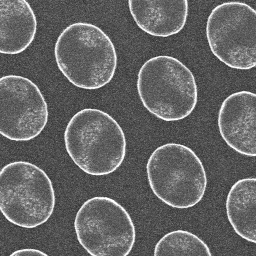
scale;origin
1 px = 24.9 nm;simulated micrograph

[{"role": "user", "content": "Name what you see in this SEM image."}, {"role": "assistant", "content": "raised bodies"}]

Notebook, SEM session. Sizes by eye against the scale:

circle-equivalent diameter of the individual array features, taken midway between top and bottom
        1520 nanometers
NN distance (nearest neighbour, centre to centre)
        2.16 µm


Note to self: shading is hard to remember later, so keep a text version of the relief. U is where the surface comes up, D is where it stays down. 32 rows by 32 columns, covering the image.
UUUDDDDDDDDDDDDDUUUUUUUDDDDDUUDD
UUUUDDDDDDDDDDDDUUUUUUUDDDDUUUUU
UUUUDDDDDDDDDDDDDUUUUUUDDDUUUUUU
UUUUDDDDDUUUDDDDDDUUUUUDDDUUUUUU
UUUUDDDDUUUUUDDDDDDDDDDDDDUUUUUU
UUUUDDDUUUUUUUDDDDDDDDDDDDUUUUUU
UUDDDDDUUUUUUUDDDDDDDDDDDDDUUUUU
DDDDDDDUUUUUUUDDDDDUUUDDDDDDUUUU
DDDDDDDDUUUUUUDDDDUUUUUDDDDDDDUD
DDDDDDDDUUUUUUDDDUUUUUUUDDDDDDDD
UUUUDDDDDUUUUDDDDUUUUUUUDDDDDDDD
UUUUUDDDDDDDDDDDDUUUUUUUDDDDDDDD
UUUUUDDDDDDDDDDDDDUUUUUUDDDDUUUU
UUUUUUDDDDDDDDDDDDUUUUUUDDDDUUUU
UUUUUUDDDUUUUUDDDDDDUUUDDDDUUUUU
UUUUUUDDDUUUUUUDDDDDDDDDDDDUUUUU
UUUUUDDDUUUUUUUDDDDDDDDDDDDDUUUU
DDDDDDDDUUUUUUUUDDDDDDDDDDDDUUUU
DDDDDDDDUUUUUUUUDDDDUUUDDDDDDUUU
DDDDDDDDDUUUUUUDDDDUUUUUDDDDDDDD
DUUUDDDDDDUUUUUDDDDUUUUUUDDDDDDD
UUUUUDDDDDDUUUDDDDUUUUUUUDDDDDDD
UUUUUUDDDDDDDDDDDDDUUUUUUUDDDDUU
UUUUUUDDDDDDDDDDDDDUUUUUUUDDDUUU
UUUUUUUDDDDDDDDDDDDDUUUUUDDDDUUU
UUUUUUUDDDDUUUUDDDDDDUUUDDDDUUUU
UUUUUUDDDDUUUUUUDDDDDDDDDDDDUUUU
DUUUUUDDDUUUUUUUDDDDDDDDDDDDDUUU
DDDDDDDDDUUUUUUUUDDDDDDDDDDDDUUU
DDDDDDDDDDUUUUUUUDDDDUUUDDDDDDUU
DDDDDDDDDDUUUUUUUDDDUUUUUUDDDDDD
DDUUUDDDDDDUUUUUDDDUUUUUUUDDDDDD